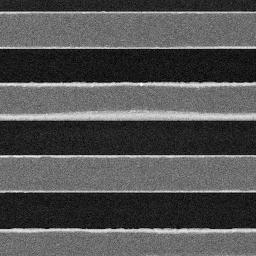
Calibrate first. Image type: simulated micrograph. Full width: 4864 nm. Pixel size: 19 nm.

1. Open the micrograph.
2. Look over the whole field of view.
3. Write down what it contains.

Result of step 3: lines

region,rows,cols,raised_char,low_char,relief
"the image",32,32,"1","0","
00000000000000000000000000000000
00000000000000000000000000000000
11111111111111111111111111111111
11111111111111111111111111111111
11111111111111111111111111111111
11111111111111111111111111111111
00000000000000000000000000000000
00000000000000000000000000000000
00000000000000000000000000000000
00000000000000000000000000000000
11111111111111111111111111111111
11111111111111111111111111111111
11111111111111111111111111111111
11111111111111111111111111111111
11111111111111111111111111111111
00000000000000000000000000000000
00000000000000000000000000000000
00000000000000000000000000000000
00000000000000000000000000000000
11111111111111111111111111111111
11111111111111111111111111111111
11111111111111111111111111111111
11111111111111111111111111111111
11111111111111111111111111111111
00000000000000000000000000000000
00000000000000000000000000000000
00000000000000000000000000000000
00000000000000000000000000000000
00000000000000000000000000000000
11111111111111111111111111111111
11111111111111111111111111111111
11111111111111111111111111111111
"